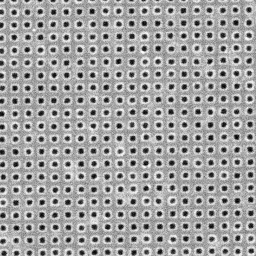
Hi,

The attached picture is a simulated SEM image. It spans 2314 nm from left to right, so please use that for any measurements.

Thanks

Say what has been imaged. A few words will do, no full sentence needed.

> a regular array of holes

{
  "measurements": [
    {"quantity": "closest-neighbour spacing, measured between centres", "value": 0.111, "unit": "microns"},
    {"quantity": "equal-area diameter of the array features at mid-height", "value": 59.5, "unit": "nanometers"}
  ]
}